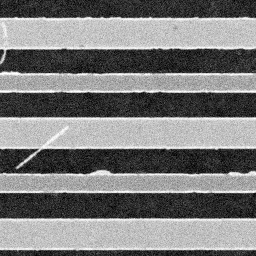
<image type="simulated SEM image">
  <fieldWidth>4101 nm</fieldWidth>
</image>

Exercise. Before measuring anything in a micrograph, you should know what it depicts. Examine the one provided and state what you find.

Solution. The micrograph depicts lines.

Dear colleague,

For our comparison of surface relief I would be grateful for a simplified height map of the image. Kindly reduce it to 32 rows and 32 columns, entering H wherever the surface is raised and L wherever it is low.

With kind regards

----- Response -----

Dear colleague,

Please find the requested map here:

LLLLLLLLLLLLLLLLLLLLLLLLLLLLLLLL
LLLLLLLLLLLLLLLLLLLLLLLLLLLLLLLL
HHHHHHHHHHHHHHHHHHHHHHHHHHHHHHHH
HHHHHHHHHHHHHHHHHHHHHHHHHHHHHHHH
HHHHHHHHHHHHHHHHHHHHHHHHHHHHHHHH
HHHHHHHHHHHHHHHHHHHHHHHHHHHHHHHH
LLLLLLLLLLLLLLLLLLLLLLLLLLLLLLLL
LLLLLLLLLLLLLLLLLLLLLLLLLLLLLLLL
LLLLLLLLLLLLLLLLLLLLLLLLLLLLLLLL
HHHHHHHHHHHHHHHHHHHHHHHHHHHHHHHH
HHHHHHHHHHHHHHHHHHHHHHHHHHHHHHHH
LLLLLLLLLLLLLLLLLLLLLLLLLLLLLLLL
LLLLLLLLLLLLLLLLLLLLLLLLLLLLLLLL
LLLLLLLLLLLLLLLLLLLLLLLLLLLLLLLL
LLLLLLLLLLLLLLLLLLLLLLLLLLLLLLLL
HHHHHHHHHHHHHHHHHHHHHHHHHHHHHHHH
HHHHHHHHHHHHHHHHHHHHHHHHHHHHHHHH
HHHHHHHHHHHHHHHHHHHHHHHHHHHHHHHH
LLLLHHLLLLLLLLLLLLLLLLLLLLLLLLLL
LLLLLLLLLLLLLLLLLLLLLLLLLLLLLLLL
LLLLLLLLLLLLLLLLLLLLLLLLLLLLLLLL
LLLLLLLLLLLLHLLLLLLLLLLLLLLLLLLL
HHHHHHHHHHHHHHHHHHHHHHHHHHHHHHHH
HHHHHHHHHHHHHHHHHHHHHHHHHHHHHHHH
LLLLLLLLLLLLLLLLLLLLLLLLLLLLLLLL
LLLLLLLLLLLLLLLLLLLLLLLLLLLLLLLL
LLLLLLLLLLLLLLLLLLLLLLLLLLLLLLLL
HHHHHHLHLHLHHHHHHHHHHHLLHHLHHHHH
HHHHHHHHHHHHHHHHHHHHHHHHHHHHHHHH
HHHHHHHHHHHHHHHHHHHHHHHHHHHHHHHH
HHHHHHHHHHHHHHHHHHHHHHHHHHHHHHHH
LLLLLLLLLLLLLLLLLLLLLLLLLLLLLLLL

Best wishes